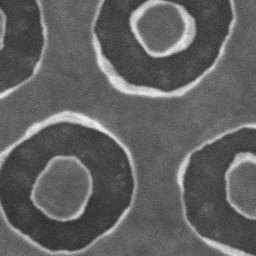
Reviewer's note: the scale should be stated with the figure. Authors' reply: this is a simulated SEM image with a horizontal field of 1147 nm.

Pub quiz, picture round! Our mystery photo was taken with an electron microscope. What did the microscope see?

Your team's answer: ring-shaped grooves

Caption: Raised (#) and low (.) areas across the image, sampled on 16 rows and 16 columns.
..####...##...##
...###..####..##
...###...###..##
...###........##
..#####......###
.#######....####
################
###..###########
##.....#######..
#.......####....
...##...####..##
..####..###...##
..###...####..##
...##...####...#
#......#####....
###..#########..